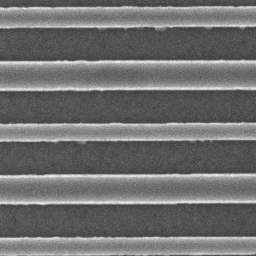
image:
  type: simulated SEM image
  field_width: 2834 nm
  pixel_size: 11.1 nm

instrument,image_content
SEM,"lines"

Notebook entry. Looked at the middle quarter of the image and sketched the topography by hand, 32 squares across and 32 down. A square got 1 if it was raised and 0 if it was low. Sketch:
11111111111111111111111111111111
11111111111111111111111111111111
11111111111111111111111111111111
11111111111111111111111111111111
11111111111111111111111111111111
11111111111111111111111111111111
00000000000000000000000000000000
00000000000000000000000000000000
00000000000000000000000000000000
00000000000000000000000000000000
00000000000000000000000000000000
00000000000000000000000000000000
00000000000000000000000000000000
00000000000000000000000000000000
00000000000000000000000000000000
11111111111111111111111111111111
11111111111111111111111111111111
11111111111111111111111111111111
11111111111111111111111111111111
00000000000000000000000000000000
00000000000000000000000000000000
00000000000000000000000000000000
00000000000000000000000000000000
00000000000000000000000000000000
00000000000000000000000000000000
00000000000000000000000000000000
00000000000000000000000000000000
00000000000000000000000000000000
11111111111111111111111111111111
11111111111111111111111111111111
11111111111111111111111111111111
11111111111111111111111111111111